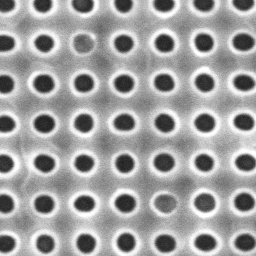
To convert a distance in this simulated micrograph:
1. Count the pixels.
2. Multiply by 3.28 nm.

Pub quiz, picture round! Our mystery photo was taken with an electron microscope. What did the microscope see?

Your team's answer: a regular array of holes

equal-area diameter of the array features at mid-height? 0.0675 micrometres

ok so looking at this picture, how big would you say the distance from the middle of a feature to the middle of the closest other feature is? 129 nm